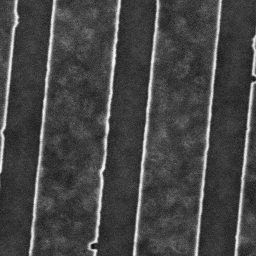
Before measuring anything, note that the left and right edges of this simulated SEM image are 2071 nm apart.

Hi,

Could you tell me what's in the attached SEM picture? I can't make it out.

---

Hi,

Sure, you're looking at one or a few lines or trenches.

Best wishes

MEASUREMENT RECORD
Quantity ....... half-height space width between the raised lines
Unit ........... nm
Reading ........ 309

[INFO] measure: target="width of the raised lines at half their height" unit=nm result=512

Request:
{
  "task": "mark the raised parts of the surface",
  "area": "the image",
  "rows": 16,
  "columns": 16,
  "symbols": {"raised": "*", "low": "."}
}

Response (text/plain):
*..****...****..
*..****...****..
*..****...****..
*..****...***...
*..****..****...
*..****..****...
...****..****...
...****..****...
...****..****..*
...****..****..*
..****...****..*
..****...****..*
..****...****..*
..****...****..*
..****...***...*
..****..****...*